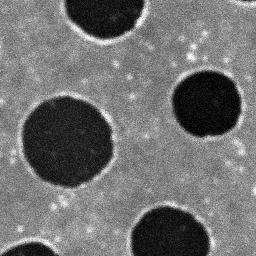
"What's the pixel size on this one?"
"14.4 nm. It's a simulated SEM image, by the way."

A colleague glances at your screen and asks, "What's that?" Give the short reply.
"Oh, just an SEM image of holes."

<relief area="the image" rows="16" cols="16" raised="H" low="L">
HHHHLLLLLHHHHHHH
HHHHHLLLLHHHHHHH
HHHHHHHHHHHHHHHH
HHHHHHHHHHHHHHHH
HHHHHHHHHHHHLLHH
HHHHHHHHHHHLLLLH
HHLLLLHHHHHLLLLH
HHLLLLLHHHHLLLLH
HLLLLLLHHHHHLLHH
HLLLLLLHHHHHHHHH
HHLLLLLHHHHHHHHH
HHHLLHHHHHHHHHHH
HHHHHHHHHHHHHHHH
HHHHHHHHHLLLHHHH
HHHHHHHHLLLLLHHH
HLLHHHHHLLLLLHHH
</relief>